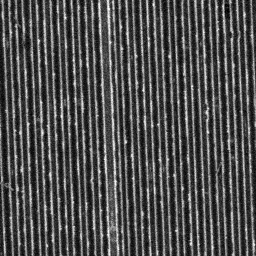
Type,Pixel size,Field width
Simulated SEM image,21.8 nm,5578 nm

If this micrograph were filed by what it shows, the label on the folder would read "parallel lines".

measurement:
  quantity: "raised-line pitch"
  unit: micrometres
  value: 0.301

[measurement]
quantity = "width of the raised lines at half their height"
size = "190 nanometers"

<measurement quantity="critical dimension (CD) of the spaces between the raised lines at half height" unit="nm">114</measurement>